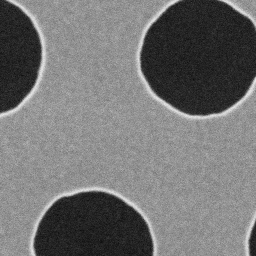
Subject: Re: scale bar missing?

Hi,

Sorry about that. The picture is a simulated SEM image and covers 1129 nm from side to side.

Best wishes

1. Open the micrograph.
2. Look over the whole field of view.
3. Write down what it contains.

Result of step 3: holes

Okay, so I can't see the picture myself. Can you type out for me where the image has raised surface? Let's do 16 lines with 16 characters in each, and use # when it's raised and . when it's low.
.##########....#
..########......
...######.......
...######.......
..#######.......
..#######.......
.#########.....#
################
################
################
################
################
####....########
###......#######
##.......#######
##........######